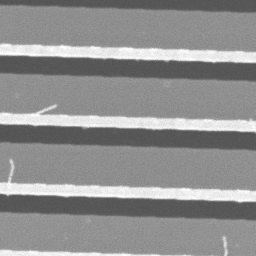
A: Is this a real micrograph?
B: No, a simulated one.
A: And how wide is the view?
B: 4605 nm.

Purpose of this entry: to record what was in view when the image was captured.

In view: lines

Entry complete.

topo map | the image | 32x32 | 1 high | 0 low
00000000000000000000000000000000
11111111111111111111111111000000
11111111111111111111111111111111
11111111111111111111111111111111
11111111111111111111111111111111
11111111111111111111111111111111
11111111111111111111111111111111
00000000000000000100111111111111
00000000000000000000000000000000
11111111100000000000000000000000
11111111111111111111111111111111
11111111111111111111111111111111
11111111111111111111111111111111
11111111111111111111111111111111
11111111111111111111111111111111
00011111111111111111111111111111
00000000000000000000000000000000
00000000000000000000000000000000
11111111111111111111000000000000
11111111111111111111111111111111
11111111111111111111111111111111
11111111111111111111111111111111
11111111111111111111111111111111
11111111111111111111111111111111
00000000101111111111111111111111
00000000000000000000000000000000
00000000000000000000000000000000
11111111111111111111111111110000
11111111111111111111111111111111
11111111111111111111111111111111
11111111111111111111111111111111
11111111111111111111111111111111